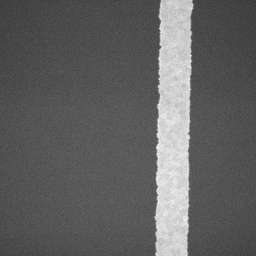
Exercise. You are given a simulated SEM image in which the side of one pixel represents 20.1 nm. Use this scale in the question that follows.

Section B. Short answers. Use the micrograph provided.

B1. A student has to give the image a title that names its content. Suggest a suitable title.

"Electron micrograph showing one or a few lines or trenches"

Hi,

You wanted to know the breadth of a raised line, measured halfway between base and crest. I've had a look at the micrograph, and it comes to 30.9 px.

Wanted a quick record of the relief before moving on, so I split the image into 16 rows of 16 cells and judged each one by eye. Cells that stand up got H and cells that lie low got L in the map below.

LLLLLLLLLLHHLLLL
LLLLLLLLLLHHLLLL
LLLLLLLLLLHHLLLL
LLLLLLLLLLHHLLLL
LLLLLLLLLLHHLLLL
LLLLLLLLLLHHLLLL
LLLLLLLLLLHHLLLL
LLLLLLLLLLHHLLLL
LLLLLLLLLLHHLLLL
LLLLLLLLLLHHLLLL
LLLLLLLLLLHHLLLL
LLLLLLLLLLHHLLLL
LLLLLLLLLLHHLLLL
LLLLLLLLLLHHLLLL
LLLLLLLLLLHHLLLL
LLLLLLLLLLHHLLLL